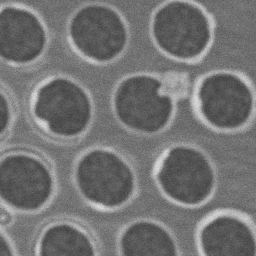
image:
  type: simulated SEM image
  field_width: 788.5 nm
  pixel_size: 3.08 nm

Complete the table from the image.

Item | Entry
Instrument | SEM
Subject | holes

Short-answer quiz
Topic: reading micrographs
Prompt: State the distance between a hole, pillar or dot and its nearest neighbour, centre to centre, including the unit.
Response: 0.251 µm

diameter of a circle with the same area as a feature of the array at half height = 169 nm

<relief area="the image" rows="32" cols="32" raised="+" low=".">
+++++++++++++++++++++...++++++++
....++++++....++++++.....+++++++
.....++++......++++.......++++++
.....++++.......+++.......++++++
......+++.......+++.......++++++
......+++.......++++......++++++
.....+++++.....++++++....+++++++
+...++++++++..++++++++++++++++++
++++++++++++++++++++++++++++++++
++++++++++++++++++++++++++...+++
++++++...++++++.....+++++......+
+++++.....++++......+++++......+
.++++......+++.......++++.......
.+++.......+++........+++.......
.++++......++++......+++++.....+
.+++++.....+++++.....+++++....++
+++++++...++++++++.+++++++++++++
++++++++++++++++++++++++++++++++
++++++++++++++++++++++.+++++++++
++.++++++++....++++++.....++++++
.....+++++......++++......++++++
......++++......++++......++++++
......++++.......+++.......+++++
......++++.......+++.......+++++
......+++++.....+++++.....++++++
+....++++++++..++++++++.++++++++
++++++++++++++++++++++++++++++++
+++++++++++++++++++++++++++...++
++++++...+++++++....++++++.....+
+++++......++++......++++.......
.++++......++++.......+++.......
.++++.......+++.......++++......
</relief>